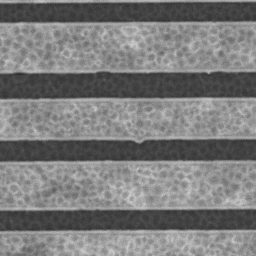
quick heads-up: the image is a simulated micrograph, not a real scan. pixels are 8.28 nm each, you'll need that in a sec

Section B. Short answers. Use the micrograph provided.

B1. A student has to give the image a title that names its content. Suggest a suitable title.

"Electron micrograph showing one or a few lines or trenches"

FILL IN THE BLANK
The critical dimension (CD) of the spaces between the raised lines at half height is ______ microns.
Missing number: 0.198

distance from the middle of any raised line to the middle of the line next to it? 572 nanometers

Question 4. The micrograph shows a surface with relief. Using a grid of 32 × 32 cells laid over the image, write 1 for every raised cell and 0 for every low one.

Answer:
00000000000000000000000000000000
00000000000000000000000000000000
00000000000000000000000000000000
11111111111111111111111111111111
11111111111111111111111111111111
11111111111111111111111111111111
11111111111111111111111111111111
11111111111111111111111111111111
11111111111111111111111111111111
00000000000000000000000000000000
00000000000000000000000000000000
00000000000000000000000000000000
00000000000000011111101111111111
11111111111111111111111111111111
11111111111111111111111111111111
11111111111111111111111111111111
11111111111111111111111111111111
00000000000000000100000000000000
00000000000000000000000000000000
00000000000000000000000000000000
11111111111111111111111111111111
11111111111111111111111111111111
11111111111111111111111111111111
11111111111111111111111111111111
11111111111111111111111111111111
11111111111111111111111111111111
00000000000000000000000000000000
00000000000000000000000000000000
00000000000000000000000000000000
11111111111111111111111111111111
11111111111111111111111111111111
11111111111111111111111111111111